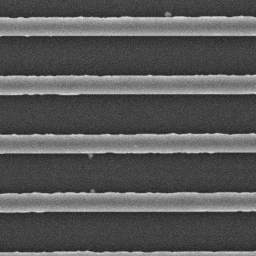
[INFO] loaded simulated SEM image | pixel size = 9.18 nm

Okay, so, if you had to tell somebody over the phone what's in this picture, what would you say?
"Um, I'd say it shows lines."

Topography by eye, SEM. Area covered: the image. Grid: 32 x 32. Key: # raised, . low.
................................
................................
################################
################################
...#............................
................................
................................
................................
................................
..........#.............########
################################
################################
................................
................................
................................
................................
................................
################################
################################
................................
................................
................................
................................
................................
################################
################################
................................
................................
................................
................................
................................
.........##.....................